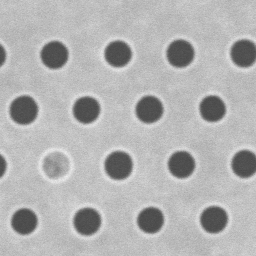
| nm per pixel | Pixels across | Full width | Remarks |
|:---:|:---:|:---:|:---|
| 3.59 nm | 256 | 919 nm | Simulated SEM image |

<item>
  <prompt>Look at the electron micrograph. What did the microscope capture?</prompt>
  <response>a regular array of holes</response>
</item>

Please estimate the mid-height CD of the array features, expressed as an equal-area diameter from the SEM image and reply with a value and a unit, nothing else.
28.4 px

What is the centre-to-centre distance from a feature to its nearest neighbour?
226 nanometres